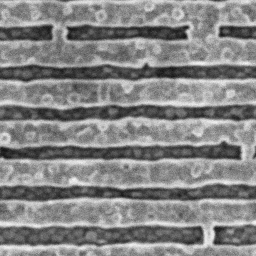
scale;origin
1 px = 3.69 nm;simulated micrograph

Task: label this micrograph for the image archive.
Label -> parallel lines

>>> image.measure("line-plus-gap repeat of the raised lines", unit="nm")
148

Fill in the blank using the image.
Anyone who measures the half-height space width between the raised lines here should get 55.8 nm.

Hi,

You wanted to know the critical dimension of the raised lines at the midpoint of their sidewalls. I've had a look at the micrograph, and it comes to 91.8 nm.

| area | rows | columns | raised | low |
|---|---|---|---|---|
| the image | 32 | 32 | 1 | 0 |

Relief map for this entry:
11111111111111111111111111111111
11111111111111111111111111111111
11111111111111111111111111111111
00000001000000000000000011100000
00000001000000000000000011100000
11111111111111111111111111111111
11111111111111111111111111111111
11111111111111111111111111111111
00000000000000000000000000000000
00000000000000000000000000000000
11111111111111111111111111111111
11111111111111111111111111111111
11111111111111111111111111111111
00000001100000000000000000000000
00000000000000000000000000000000
11111111111111111111111111111111
11111111111111111111111111111111
11111111111111111111111111111111
00100000000000000000000000000011
00000000000000000000000000000011
11111111111111111111111111111111
11111111111111111111111111111111
11111111111111111111111111111111
00000000000000000000000000000000
00000000000000000000000000000000
11111111111111111111111111111111
11111111111111111111111111111111
11111111111111111111111111111111
00000000000000000000000001100000
00000000000000000000000000100000
00000000000000000000010001100000
11111111111111111111111111111111